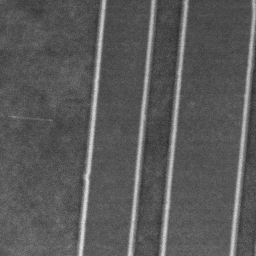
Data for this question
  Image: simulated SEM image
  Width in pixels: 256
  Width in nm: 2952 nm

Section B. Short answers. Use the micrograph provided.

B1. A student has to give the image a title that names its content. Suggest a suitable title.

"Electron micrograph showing one or a few lines or trenches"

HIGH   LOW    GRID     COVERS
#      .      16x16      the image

......####..####
......###...####
......###..#####
......###..#####
......###..#####
......###..####.
......###..####.
......###..####.
......###..####.
......###..####.
......###..####.
.....####..####.
.....###...####.
.....###..#####.
.....###..#####.
.....###..#####.